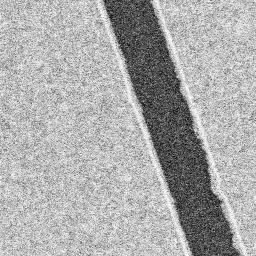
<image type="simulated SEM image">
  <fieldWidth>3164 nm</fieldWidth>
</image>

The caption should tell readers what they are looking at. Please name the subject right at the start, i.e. one or a few lines or trenches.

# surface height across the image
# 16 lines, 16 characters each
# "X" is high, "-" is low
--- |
XXXXXX----XXXXXX
XXXXXXX---XXXXXX
XXXXXXX----XXXXX
XXXXXXX----XXXXX
XXXXXXXX---XXXXX
XXXXXXXX----XXXX
XXXXXXXX----XXXX
XXXXXXXXX---XXXX
XXXXXXXXX----XXX
XXXXXXXXX----XXX
XXXXXXXXXX---XXX
XXXXXXXXXX----XX
XXXXXXXXXX----XX
XXXXXXXXXXX----X
XXXXXXXXXXX----X
XXXXXXXXXXXX---X